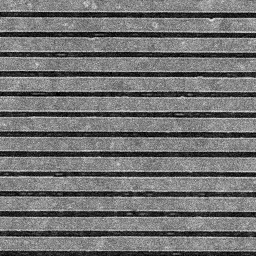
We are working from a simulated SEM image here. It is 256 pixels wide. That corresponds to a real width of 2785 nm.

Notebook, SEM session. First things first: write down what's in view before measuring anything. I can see parallel lines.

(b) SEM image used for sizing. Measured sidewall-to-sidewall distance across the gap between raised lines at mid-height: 68 nm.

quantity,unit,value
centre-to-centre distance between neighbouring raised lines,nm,216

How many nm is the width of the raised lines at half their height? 147